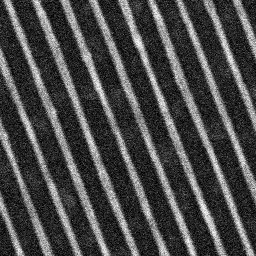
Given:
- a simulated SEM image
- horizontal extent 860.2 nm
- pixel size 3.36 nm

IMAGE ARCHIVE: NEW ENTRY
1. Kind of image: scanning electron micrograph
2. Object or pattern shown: parallel lines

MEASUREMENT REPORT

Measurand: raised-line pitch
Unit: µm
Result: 0.0897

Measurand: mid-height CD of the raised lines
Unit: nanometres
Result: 19.9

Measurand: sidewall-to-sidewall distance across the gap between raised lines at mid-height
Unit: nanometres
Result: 71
